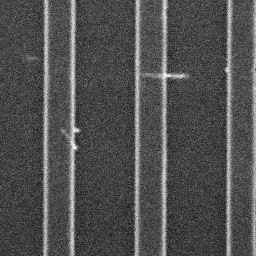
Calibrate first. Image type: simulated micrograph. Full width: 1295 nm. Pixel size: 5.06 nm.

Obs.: one or a few lines or trenches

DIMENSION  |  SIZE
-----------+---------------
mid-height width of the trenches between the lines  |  0.319 microns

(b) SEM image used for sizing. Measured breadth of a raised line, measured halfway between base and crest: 0.145 um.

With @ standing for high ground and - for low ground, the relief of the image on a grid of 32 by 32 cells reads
------@@@--------@@@@--------@@@
------@@@--------@@@@--------@@@
------@@@--------@@@@--------@@@
------@@@--------@@@@--------@@@
------@@@--------@@@@--------@@@
------@@@--------@@@@--------@@@
------@@@--------@@@@--------@@@
------@@@--------@@@@--------@@@
------@@@--------@@@@--------@@@
------@@@--------@@@@--------@@@
------@@@--------@@@@--------@@@
------@@@--------@@@@--------@@@
------@@@--------@@@@--------@@@
------@@@--------@@@@--------@@@
------@@@--------@@@@--------@@@
------@@@--------@@@@--------@@@
------@@@--------@@@@--------@@@
------@@@--------@@@@--------@@@
------@@@--------@@@@--------@@@
------@@@--------@@@@--------@@@
------@@@--------@@@@--------@@@
------@@@--------@@@@--------@@@
------@@@--------@@@@--------@@@
------@@@--------@@@@--------@@@
------@@@--------@@@@--------@@@
------@@@--------@@@@--------@@@
------@@@--------@@@@--------@@@
------@@@--------@@@@--------@@@
------@@@--------@@@@--------@@@
------@@@--------@@@@--------@@@
------@@@--------@@@@--------@@@
------@@@--------@@@@--------@@@